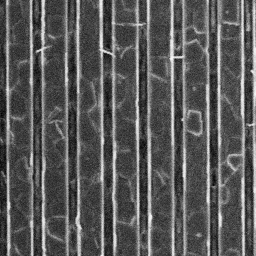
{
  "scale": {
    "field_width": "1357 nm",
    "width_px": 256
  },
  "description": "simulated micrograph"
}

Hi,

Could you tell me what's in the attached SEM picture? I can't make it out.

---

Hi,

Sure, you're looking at parallel lines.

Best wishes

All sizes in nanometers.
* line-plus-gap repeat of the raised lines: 187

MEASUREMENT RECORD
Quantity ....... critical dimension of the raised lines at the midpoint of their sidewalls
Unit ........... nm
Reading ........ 136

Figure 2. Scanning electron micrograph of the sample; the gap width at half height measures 52.3 nm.